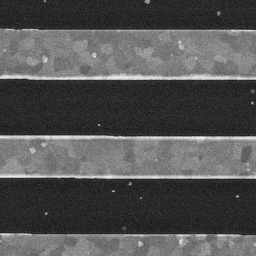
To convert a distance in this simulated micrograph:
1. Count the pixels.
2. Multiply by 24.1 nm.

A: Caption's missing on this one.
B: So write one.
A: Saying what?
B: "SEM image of lines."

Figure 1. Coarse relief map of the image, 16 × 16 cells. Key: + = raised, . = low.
................
................
++++++++++++++++
++++++++++++++++
++++++++++++++++
................
................
................
................
++++++++++++++++
++++++++++++++++
................
................
................
................
++++++++++++++++